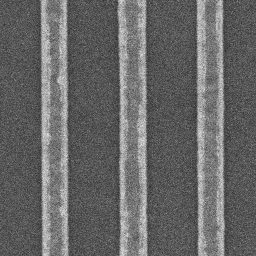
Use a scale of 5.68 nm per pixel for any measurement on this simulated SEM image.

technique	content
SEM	one or a few lines or trenches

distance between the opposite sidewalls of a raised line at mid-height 125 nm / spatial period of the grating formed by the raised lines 0.443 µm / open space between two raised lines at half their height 321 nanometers